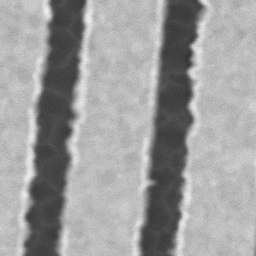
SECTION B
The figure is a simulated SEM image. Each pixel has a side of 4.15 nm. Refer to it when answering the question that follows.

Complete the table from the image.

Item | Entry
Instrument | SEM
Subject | one or a few lines or trenches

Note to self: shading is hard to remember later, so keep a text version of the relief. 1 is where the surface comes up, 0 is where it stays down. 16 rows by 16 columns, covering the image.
1110011111000111
1110011111001111
1110011111001111
1110011111001111
1110011111001111
1110011111001111
1100011111001111
1100011111001111
1100111110001111
1100111110001111
1100111110001111
1100111110001111
1100111110011111
1100111110011111
1100111110011111
1000111110011111